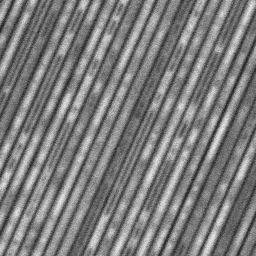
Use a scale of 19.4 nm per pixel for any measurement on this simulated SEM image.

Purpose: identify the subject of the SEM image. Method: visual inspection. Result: parallel lines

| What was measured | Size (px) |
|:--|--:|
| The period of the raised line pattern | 5.93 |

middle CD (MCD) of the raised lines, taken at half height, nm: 91.1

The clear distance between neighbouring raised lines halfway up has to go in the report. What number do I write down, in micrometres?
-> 0.0355